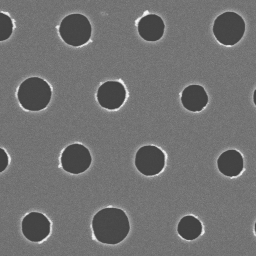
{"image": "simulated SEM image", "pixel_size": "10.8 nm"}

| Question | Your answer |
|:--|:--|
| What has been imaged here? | a regular array of holes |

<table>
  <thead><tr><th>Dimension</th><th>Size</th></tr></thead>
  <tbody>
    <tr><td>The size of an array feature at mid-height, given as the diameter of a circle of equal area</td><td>318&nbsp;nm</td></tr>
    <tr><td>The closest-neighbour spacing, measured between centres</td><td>0.809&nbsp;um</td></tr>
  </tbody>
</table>